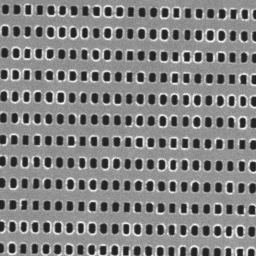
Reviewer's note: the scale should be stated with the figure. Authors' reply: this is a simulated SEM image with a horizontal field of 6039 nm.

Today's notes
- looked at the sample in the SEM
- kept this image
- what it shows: a regular array of holes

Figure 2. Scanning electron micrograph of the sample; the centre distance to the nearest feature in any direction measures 263 nanometres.